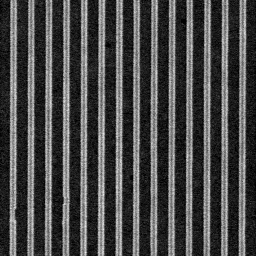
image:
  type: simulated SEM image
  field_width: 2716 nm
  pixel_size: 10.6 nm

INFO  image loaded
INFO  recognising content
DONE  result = parallel lines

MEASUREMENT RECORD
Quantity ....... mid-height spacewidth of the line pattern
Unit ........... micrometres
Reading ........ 0.142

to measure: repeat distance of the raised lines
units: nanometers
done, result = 187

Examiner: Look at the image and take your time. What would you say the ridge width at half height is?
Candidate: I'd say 0.0451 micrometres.